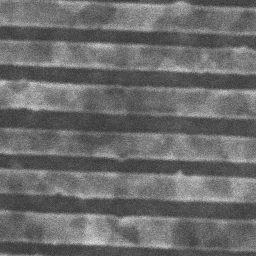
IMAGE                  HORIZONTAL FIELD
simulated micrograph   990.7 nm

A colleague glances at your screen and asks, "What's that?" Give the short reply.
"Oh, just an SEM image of parallel lines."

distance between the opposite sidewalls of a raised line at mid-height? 93.8 nanometres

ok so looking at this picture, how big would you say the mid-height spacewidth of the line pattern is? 68.7 nm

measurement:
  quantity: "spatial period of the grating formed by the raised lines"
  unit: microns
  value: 0.166